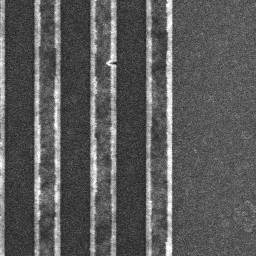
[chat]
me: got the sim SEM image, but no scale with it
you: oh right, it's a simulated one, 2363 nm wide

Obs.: parallel lines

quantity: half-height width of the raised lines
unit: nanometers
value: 202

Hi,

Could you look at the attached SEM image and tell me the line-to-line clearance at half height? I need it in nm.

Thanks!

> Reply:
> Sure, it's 316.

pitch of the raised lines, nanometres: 517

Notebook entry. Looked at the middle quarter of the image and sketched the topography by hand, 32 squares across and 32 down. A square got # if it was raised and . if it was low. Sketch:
.......######........#####......
.......######........#####......
.......######........#####......
.......######........#####......
.......######........#####......
.......######........#####......
.......######........#####......
.......######........#####......
.......######........#####......
.......######........#####......
.......######........#####......
.......######........#####......
.......######........#####......
.......######........#####......
.......######........#####......
.......######........#####......
.......######........#####......
.......######........#####......
.......######........#####......
.......######........#####......
.......######........#####......
.......#####.........#####......
.......#####.........#####......
.......#####.........#####......
.......#####.........#####......
.......#####.........#####......
.......#####.........#####......
.......#####.........#####......
.......#####.........#####......
.......#####.........#####......
.......#####.........#####......
.......#####.........#####......